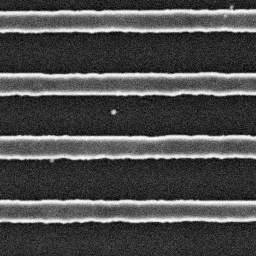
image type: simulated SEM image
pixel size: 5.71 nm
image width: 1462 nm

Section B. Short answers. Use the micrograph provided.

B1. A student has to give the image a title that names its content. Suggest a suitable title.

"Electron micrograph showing lines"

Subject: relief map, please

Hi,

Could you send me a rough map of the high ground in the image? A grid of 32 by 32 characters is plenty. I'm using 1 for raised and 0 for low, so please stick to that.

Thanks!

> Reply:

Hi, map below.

00000000000000000000000000000000
00000001101111111111111111111111
11111111111111111111111111111111
11111111111111111111111111111111
00000000000000000000000000000000
00000000000000000000000000000000
00000000000000000000000000000000
00000000000000000000000000000000
00000000000000000000000000000000
11111111111111111111111111111111
11111111111111111111111111111111
11111111111111111111111111111111
00000000000000000000000000000000
00000000000000000000000000000000
00000000000000000000000000000000
00000000000000000000000000000000
00000000000000000000000000000000
11111111111111111111111111111111
11111111111111111111111111111111
11111111111111111111111111111111
00000000000000000000000000000000
00000000000000000000000000000000
00000000000000000000000000000000
00000000000000000000000000000000
00000000000000000000000000000000
11111111111111111111111111111111
11111111111111111111111111111111
11111111111111111111111111111111
00000000000000000000000000000000
00000000000000000000000000000000
00000000000000000000000000000000
00000000000000000000000000000000